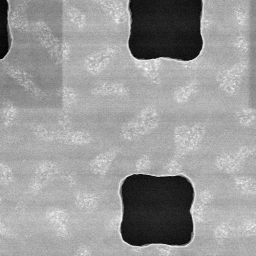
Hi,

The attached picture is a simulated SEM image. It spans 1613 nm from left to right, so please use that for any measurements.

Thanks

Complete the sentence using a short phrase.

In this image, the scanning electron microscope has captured holes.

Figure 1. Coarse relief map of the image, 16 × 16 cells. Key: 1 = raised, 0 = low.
0111111100000111
0111111100000111
0111111100000111
1111111100001111
1111111111111111
1111111111111111
1111111111111111
1111111111111111
1111111111111111
1111111111111111
1111111111111111
1111111100001111
1111111100001111
1111111100001111
1111111100001111
1111111111111111